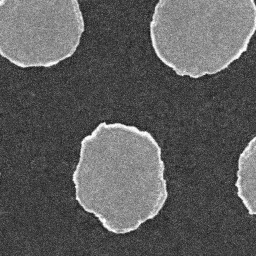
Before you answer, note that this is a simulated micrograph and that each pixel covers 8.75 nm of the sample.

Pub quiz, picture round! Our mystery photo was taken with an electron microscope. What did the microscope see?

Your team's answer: raised bodies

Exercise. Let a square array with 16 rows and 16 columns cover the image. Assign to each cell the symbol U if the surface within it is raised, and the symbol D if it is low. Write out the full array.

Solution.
UUUUUDDDDDUUUUUU
UUUUUDDDDDUUUUUU
UUUUUDDDDDUUUUUU
UUUUDDDDDDUUUUUD
DDDDDDDDDDDUUDDD
DDDDDDDDDDDDDDDD
DDDDDDDDDDDDDDDD
DDDDDDDDDDDDDDDD
DDDDDDUUUDDDDDDD
DDDDDUUUUUDDDDDU
DDDDDUUUUUDDDDDU
DDDDDUUUUUDDDDDU
DDDDDUUUUUDDDDDU
DDDDDDUUUUDDDDDD
DDDDDDDUDDDDDDDD
DDDDDDDDDDDDDDDD